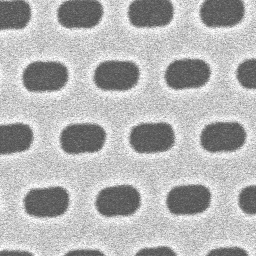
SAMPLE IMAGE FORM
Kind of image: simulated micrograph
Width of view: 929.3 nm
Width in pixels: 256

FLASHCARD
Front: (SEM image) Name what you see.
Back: a regular array of holes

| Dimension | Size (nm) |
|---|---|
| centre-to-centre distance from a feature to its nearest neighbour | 257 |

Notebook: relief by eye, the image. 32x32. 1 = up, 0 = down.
00001111000001110000001110000011
00001110000001110000001110000001
00001110000001110000011110000011
00011111000111111101111111111111
11111111111111111111111111111111
11111111111111111111111111111111
11111111111111111111111111111111
11111111111111111111110001111110
11100000111100000111100000111100
11100000011100000111000000111000
11100000111100000111100000111100
11110011111111111111111111111111
11111111111111111111111111111111
11111111111111111111111111111111
11111111111111111111111111111111
10011111100011111000011111000011
00001111000001110000001110000001
00001110000001110000001110000001
00001111000001111000011110000011
11111111111111111111111111111111
11111111111111111111111111111111
11111111111111111111111111111111
11111111111111111111111111111111
11110000111110000111110000111100
11100000011100000011100000111100
11100000011100000011100000111100
11100000111100000111100001111100
11111111111111111111111111111111
11111111111111111111111111111111
11111111111111111111111111111111
11111111111111111111111111111111
00001111000001111000001111000001